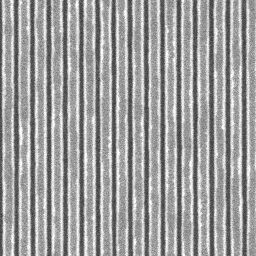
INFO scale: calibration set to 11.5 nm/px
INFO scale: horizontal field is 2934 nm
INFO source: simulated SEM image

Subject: parallel lines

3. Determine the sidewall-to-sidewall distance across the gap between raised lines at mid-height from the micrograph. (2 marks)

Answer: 0.0716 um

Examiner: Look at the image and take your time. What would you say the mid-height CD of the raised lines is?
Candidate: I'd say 115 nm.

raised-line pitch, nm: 186